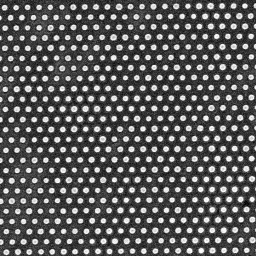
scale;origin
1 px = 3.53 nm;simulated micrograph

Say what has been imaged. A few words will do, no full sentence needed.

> a regular array of raised bodies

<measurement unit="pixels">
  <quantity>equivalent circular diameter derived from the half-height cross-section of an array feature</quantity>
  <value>4.93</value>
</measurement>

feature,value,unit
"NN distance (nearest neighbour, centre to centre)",39.8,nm